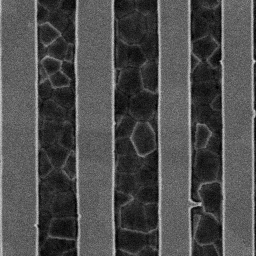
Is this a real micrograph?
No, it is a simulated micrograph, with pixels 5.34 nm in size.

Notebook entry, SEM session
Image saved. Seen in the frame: one or a few lines or trenches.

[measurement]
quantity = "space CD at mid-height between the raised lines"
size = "0.209 µm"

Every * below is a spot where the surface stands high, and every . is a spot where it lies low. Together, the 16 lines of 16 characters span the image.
**...**...**..**
**...**...**..**
**...**...**..**
**...**...**..**
**...**...**..**
**...**...**..**
**...**...**..**
**...**...**..**
**...**...**..**
**...**...**..**
**...**...**..**
**...**...**..**
**...**...**..**
**...**...**..**
**...**...**..**
**...**...**..**